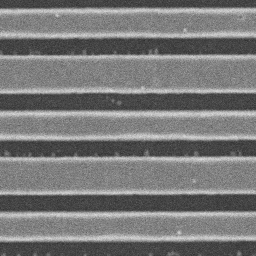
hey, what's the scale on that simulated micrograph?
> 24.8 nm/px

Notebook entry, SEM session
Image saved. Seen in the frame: lines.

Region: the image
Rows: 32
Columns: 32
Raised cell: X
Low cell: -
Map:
--------------------------------
XXXXXXXXXXXXXXXXXXXXXXXXXXXXXXXX
XXXXXXXXXXXXXXXXXXXXXXXXXXXXXXXX
XXXXXXXXXXXXXXXXXXXXXXXXXXXXXXXX
XXXXXXXXXXXXXXXXXXXXXXXXXXXXXXXX
--------------------------------
--------------------------------
XXXXXXXXXXXXXXXXXXXXXXXXXXXXXXXX
XXXXXXXXXXXXXXXXXXXXXXXXXXXXXXXX
XXXXXXXXXXXXXXXXXXXXXXXXXXXXXXXX
XXXXXXXXXXXXXXXXXXXXXXXXXXXXXXXX
XXXXXXXXXXXXXXXXXXXXXXXXXXXXXXXX
--------------------------------
--------------------------------
XXXXXXXXXXXXXXXXXXXXXXXXXXXXXXXX
XXXXXXXXXXXXXXXXXXXXXXXXXXXXXXXX
XXXXXXXXXXXXXXXXXXXXXXXXXXXXXXXX
--------------------------------
--------------------------------
--------------------------------
XXXXXXXXXXXXXXXXXXXXXXXXXXXXXXXX
XXXXXXXXXXXXXXXXXXXXXXXXXXXXXXXX
XXXXXXXXXXXXXXXXXXXXXXXXXXXXXXXX
XXXXXXXXXXXXXXXXXXXXXXXXXXXXXXXX
--------------------------------
--------------------------------
--------------------------------
XXXXXXXXXXXXXXXXXXXXXXXXXXXXXXXX
XXXXXXXXXXXXXXXXXXXXXXXXXXXXXXXX
XXXXXXXXXXXXXXXXXXXXXXXXXXXXXXXX
--------------------------------
--------------------------------